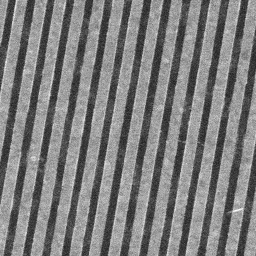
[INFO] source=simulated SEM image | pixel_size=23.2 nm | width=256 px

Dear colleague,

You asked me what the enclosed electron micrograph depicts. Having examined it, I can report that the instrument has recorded parallel lines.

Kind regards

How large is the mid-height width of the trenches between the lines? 206 nm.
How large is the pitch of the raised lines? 444 nm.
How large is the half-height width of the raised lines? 0.235 microns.